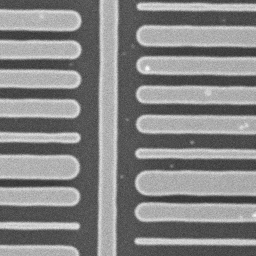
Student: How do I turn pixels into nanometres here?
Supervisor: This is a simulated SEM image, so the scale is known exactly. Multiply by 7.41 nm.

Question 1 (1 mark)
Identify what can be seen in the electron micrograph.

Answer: groups of lines, slits or small figures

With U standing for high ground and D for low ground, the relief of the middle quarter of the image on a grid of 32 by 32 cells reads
DDDDDDDDDUUUUDDDDDUUUUUUUUUUUUUU
DDDDDDDDDUUUUDDDDDDUUUUUUUUUUUUU
UUUDDDDDDUUUUDDDDDDDDDDUUUUUUUUU
UUUUDDDDDUUUUDDDDDDDDDDDDDDDDDDD
UUUUDDDDDUUUUDDDDDDDDDDDDDDDDDDD
UUUDDDDDDUUUUDDDDDDDUDDDDDDDDDDU
DDDDDDDDDUUUUDDDDDDUUUUUUUUUUUUU
DDDDDDDDDUUUUDDDDDUUUUUUUUUUUUUU
DDDDDDDDDUUUUDDDDDUUUUUUUUUUUUUU
UUUDDDDDDUUUUDDDDDDUUUUUUUUUUUUU
UUUUDDDDDUUUUDDDDDDDDDDDDDDDDDDD
UUUUDDDDDUUUUDDDDDDDDDDDDDDDDDDD
UUUUDDDDDUUUUDDDDDDDDDDDDDDDDDDD
DDDDDDDDDUUUUDDDDDDUUUUUUUUUUUUU
DDDDDDDDDUUUUDDDDDUUUUUUUUUUUUUU
DDDDDDDDDUUUUDDDDDUUUUUUUUUUUUUU
DDDDDDDDDUUUUDDDDDDUUUUUUUUUUUUU
UUUUDDDDDUUUUDDDDDDDDDDDDDDDDDDD
UUUUDDDDDUUUUDDDDDDDDDDDDDDDDDDD
DDDDDDDDDUUUUDDDDDDDDDDDDDDDDDDD
DDDDDDDDDUUUUDDDDDDDDDDDDDDDDDDD
DDDDDDDDDUUUUDDDDDDUUUUUUUUDDDUU
DDDDDDDDDUUUUDDDDDUUUUUUUUUUUUUU
UUUDDDDDDUUUUDDDDDDDDDDDDDDDDUUU
UUUDDDDDDUUUUDDDDDDDDDDDDDDDDDDD
UUUUDDDDDUUUUDDDDDDDDDDDDDDDDDDD
UUUUDDDDDUUUUDDDDDDDDDDDDDDDDDDD
UUUDDDDDDUUUUDDDDDDUUUUUUUUUUUUU
UUDDDDDDDUUUUDDDDDUUUUUUUUUUUUUU
DDDDDDDDDUUUUDDDDDUUUUUUUUUUUUUU
DDDDDDDDDUUUUDDDDDUUUUUUUUUUUUUU
UUUDDDDDDUUUUDDDDDDUUUUUUUUUUUUU